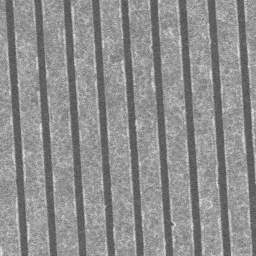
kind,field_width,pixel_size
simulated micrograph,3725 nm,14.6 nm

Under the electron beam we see parallel lines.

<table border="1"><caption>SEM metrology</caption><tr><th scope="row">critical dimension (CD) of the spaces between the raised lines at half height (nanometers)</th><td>113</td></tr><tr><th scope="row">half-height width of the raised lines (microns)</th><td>0.271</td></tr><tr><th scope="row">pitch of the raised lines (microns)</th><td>0.42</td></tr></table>